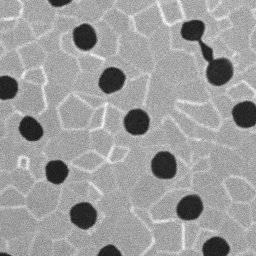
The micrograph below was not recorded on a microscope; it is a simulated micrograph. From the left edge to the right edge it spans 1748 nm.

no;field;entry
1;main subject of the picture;a regular array of holes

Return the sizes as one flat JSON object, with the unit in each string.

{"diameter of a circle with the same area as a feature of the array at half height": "182 nm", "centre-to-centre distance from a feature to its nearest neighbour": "338 nanometers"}